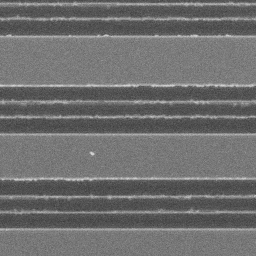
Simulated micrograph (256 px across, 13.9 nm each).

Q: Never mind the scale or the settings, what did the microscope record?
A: lines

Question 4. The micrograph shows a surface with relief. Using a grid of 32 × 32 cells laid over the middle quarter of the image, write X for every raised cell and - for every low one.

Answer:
XXXXXXXXXXXXXXXXXXXXXXXXXXXXXXXX
XXXXXXXXXXXXXXXXXXXXXXXXXXXXXXXX
XXXXXXXXXXXXXXXXXXXXXXXXXXXXXXXX
XXXXXXXXXXXXXXXXXXXXXXXXXXXXXXXX
XXXXXXXXXXXXXXXXXXXXXXXXXXXXXXXX
--------------------------------
--------------------------------
--------------------------------
--------------------------------
------------------X----X-XXXXXXX
XXXXXXXXXXXXXXXXXXXXXXXXXXXXXXXX
XXXXXXXXXXXXXXXXXXXXXXXXXXXXXXXX
XXXXXXXXXXXXXXXXXXXXXXXXXXXXXXXX
--------------------------------
--------------------------------
--------------------------------
--------------------------------
--------------------------------
XXXXXXXXXXXXXXXXXXXXXXXXXXXXXXXX
XXXXXXXXXXXXXXXXXXXXXXXXXXXXXXXX
XXXXXXXXXXXXXXXXXXXXXXXXXXXXXXXX
XXXXXXXXXXXXXXXXXXXXXXXXXXXXXXXX
XXXXXXXXXXXXXXXXXXXXXXXXXXXXXXXX
XXXXXXXXXXXXXXXXXXXXXXXXXXXXXXXX
XXXXXXXXXXXXXXXXXXXXXXXXXXXXXXXX
XXXXXXXXXXXXXXXXXXXXXXXXXXXXXXXX
XXXXXXXXXXXXXXXXXXXXXXXXXXXXXXXX
XXXXXXXXXXXXXXXXXXXXXXXXXXXXXXXX
XXXXXXXXXXXXXXXXXXXXXXXXXXXXXXXX
--------------------------------
--------------------------------
--------------------------------